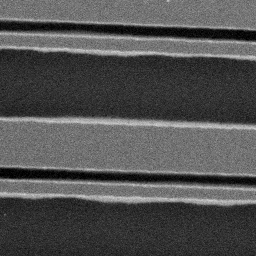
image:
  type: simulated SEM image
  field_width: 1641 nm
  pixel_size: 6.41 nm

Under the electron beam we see lines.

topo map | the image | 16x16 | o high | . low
oooooooooooooooo
oooooooooooooooo
oooooooooooooooo
..............oo
................
................
................
oo..............
oooooooooooooooo
oooooooooooooooo
oooooooooooooooo
oooooooooooooooo
............oooo
................
................
................